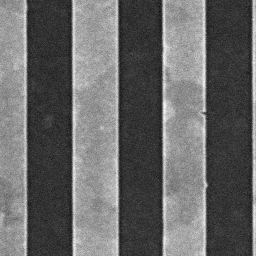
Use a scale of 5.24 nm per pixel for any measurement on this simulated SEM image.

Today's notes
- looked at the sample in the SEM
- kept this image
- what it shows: one or a few lines or trenches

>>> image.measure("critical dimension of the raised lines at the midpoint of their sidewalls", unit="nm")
223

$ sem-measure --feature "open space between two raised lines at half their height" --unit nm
244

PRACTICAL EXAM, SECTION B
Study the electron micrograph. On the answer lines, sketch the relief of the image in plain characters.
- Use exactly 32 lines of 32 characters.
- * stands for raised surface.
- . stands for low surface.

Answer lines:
***......******......****.......
***......******......****.......
***......******......****.......
***......******......****.......
***......******......*****......
***......******......*****......
***......******......*****......
***......******......*****......
***......******......*****......
***......******......*****......
***......******......*****......
***......******......*****......
***......******......*****......
***......******......*****......
***......******......****.......
***......******......*****......
***......******......*****......
***......******......*****......
***......******......****.......
***......******......*****......
***......******......*****......
***......******......*****......
***......******......*****......
***......******......*****......
***......******......*****......
***......******......*****......
***......******......*****......
***......******......*****......
***......******......*****......
***......******......*****......
***......******......*****......
***......******......****.......